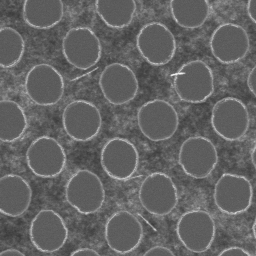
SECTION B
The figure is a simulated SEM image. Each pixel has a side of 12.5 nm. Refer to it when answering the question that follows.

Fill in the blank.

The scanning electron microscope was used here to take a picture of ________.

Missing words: a regular array of raised bodies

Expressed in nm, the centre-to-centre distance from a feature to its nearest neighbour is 645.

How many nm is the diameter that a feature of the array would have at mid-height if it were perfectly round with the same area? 486